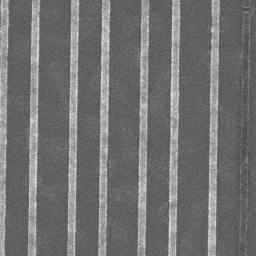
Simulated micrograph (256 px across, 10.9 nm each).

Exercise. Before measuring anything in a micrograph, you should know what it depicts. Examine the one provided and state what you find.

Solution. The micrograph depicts parallel lines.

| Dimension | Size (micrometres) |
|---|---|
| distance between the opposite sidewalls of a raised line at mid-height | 0.0762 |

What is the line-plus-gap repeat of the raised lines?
382 nm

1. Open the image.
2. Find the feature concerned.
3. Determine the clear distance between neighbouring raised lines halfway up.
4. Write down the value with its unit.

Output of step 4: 0.268 microns